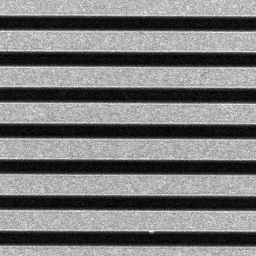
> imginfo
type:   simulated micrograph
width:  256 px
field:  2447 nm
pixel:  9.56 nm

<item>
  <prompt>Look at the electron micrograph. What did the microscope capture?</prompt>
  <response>parallel lines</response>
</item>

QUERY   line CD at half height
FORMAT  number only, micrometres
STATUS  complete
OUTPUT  0.22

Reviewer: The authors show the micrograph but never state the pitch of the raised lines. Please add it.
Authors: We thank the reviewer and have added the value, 343 nanometers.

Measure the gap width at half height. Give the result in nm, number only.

127